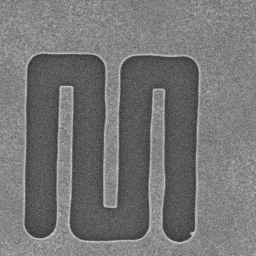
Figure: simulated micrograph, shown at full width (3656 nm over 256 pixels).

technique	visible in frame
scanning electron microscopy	groups of lines, slits or small figures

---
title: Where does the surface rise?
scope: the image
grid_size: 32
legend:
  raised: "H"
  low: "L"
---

HHHHHHHHHHHHHHHHHHHHHHHHHHHHHHHH
HHHHHHHHHHHHHHHHHHHHHHHHHHHHHHHH
HHHHHHHHHHHHHHHHHHHHHHHHHHHHHHHH
HHHHHHHHHHHHHHHHHHHHHHHHHHHHHHHH
HHHHHHHHHHHHHHHHHHHHHHHHHHHHHHHH
HHHHHHHHHHHHHHHHHHHHHHHHHHHHHHHH
HHHHHHHHHHHHHHHHHHHHHHHHHHHHHHHH
HHHHLLLLLLLLLHHHLLLLLLLLHHHHHHHH
HHHLLLLLLLLLLHHLLLLLLLLLLHHHHHHH
HHHLLLLLLLLLLHHLLLLLLLLLLHHHHHHH
HHHLLLLLLLLLLHHLLLLLLLLLLHHHHHHH
HHHLLLLHHLLLLHHLLLLHHLLLLHHHHHHH
HHHLLLLHHLLLLHHLLLLHHLLLLHHHHHHH
HHHLLLLHHLLLLHHLLLLHLLLLLHHHHHHH
HHHLLLLHHLLLLHHLLLLHLLLLLHHHHHHH
HHHLLLLHHLLLLHHLLLLHLLLLLHHHHHHH
HHHLLLLHHLLLLHHLLLLHLLLLLHHHHHHH
HHHLLLLHHLLLLHHLLLLHLLLLLHHHHHHH
HHHLLLLHHLLLLHHLLLLHLLLLLHHHHHHH
HHHLLLLHHLLLLHHLLLLHLLLLLHHHHHHH
HHHLLLLHHLLLLHHLLLLHLLLLLHHHHHHH
HHHLLLLHHLLLLHHLLLLHHLLLLHHHHHHH
HHHLLLLHHLLLLHHLLLLHHLLLLHHHHHHH
HHHLLLLHHLLLLHHLLLLHHLLLLHHHHHHH
HHHLLLLHHLLLLHHLLLLHLLLLLHHHHHHH
HHHLLLLHHLLLLHHLLLLHLLLLHHHHHHHH
HHHLLLLHHLLLLLLLLLLHLLLLHHHHHHHH
HHHLLLLHHLLLLLLLLLLHLLLLHHHHHHHH
HHHLLLLHHLLLLLLLLLLHLLLLHHHHHHHH
HHHHLLHHHLLLLLLLLLHHHLLLHHHHHHHH
HHHHHHHHHHHHHHHHHHHHHHHHHHHHHHHH
HHHHHHHHHHHHHHHHHHHHHHHHHHHHHHHH